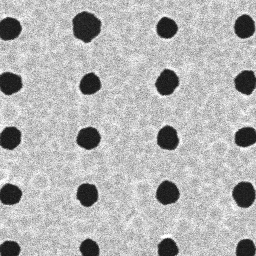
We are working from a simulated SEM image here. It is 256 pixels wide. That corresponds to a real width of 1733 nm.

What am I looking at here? a regular array of holes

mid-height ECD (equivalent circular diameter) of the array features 0.158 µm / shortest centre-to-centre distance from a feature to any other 370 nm